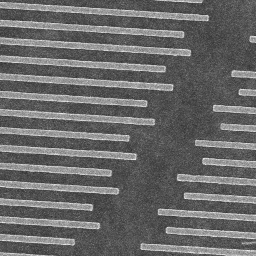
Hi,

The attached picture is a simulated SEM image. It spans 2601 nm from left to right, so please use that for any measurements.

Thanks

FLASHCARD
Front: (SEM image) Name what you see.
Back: parallel lines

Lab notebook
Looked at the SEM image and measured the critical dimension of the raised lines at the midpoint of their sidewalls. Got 65.9 nanometers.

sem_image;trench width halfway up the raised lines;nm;118